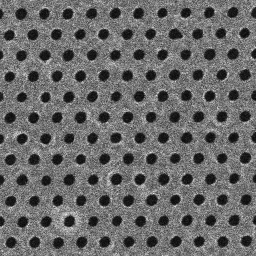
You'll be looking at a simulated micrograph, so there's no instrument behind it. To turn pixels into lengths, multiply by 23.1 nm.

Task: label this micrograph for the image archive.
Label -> a regular array of holes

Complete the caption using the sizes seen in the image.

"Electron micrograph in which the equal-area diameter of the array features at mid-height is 11.3 px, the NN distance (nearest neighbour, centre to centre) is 538 nm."